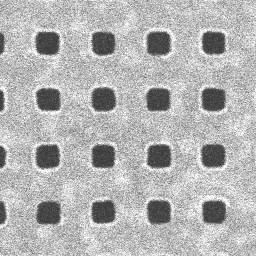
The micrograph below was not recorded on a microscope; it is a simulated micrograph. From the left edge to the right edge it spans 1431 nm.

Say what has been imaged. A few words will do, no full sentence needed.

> a regular array of holes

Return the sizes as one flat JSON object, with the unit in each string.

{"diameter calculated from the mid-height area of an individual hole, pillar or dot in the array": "140 nm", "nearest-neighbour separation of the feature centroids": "306 nm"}